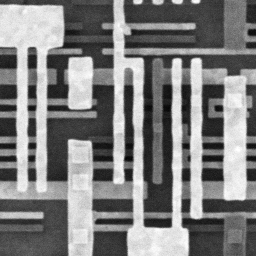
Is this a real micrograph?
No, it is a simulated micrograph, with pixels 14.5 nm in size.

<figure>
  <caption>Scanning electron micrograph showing wiring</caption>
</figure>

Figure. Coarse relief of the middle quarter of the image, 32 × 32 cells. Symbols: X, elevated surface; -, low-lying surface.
-XXXXXX------XXXXXXX--XXX--XX---
-XXXXXX------XX--XXX--XXX--XX---
-XXXXXX------XX---XX--XXX--XX---
-XXXXXX------XX---XX--XXX--XX---
-XXXXXX------XX---XX--XXX--XX---
-XXXXXX------XX---XX--XXX--XX---
-XXXXXX------XX---XX--XXX--XX---
-XXXXXX------XX---XX--XXX--XX---
-XXXXXX------XX---XX--XX---XX---
-XXXXXX------XX---XX---XX--XX---
-XXXXXX------XX---XX--XXX--XX---
-------------XX---XX--XXX--XX---
-------------XX--XXX--XXX--XX---
-------------XX--XXX--XX---XX---
-------------XX--XXX--XXX--XX---
-------------XX---XX--XXX--XX---
-------------XX---XX--XXX--XX---
-------------XX---XX---XX--XX---
-------------XX---XX---XX--XX---
-XXXXXX------XX---XX--XX---XX---
-XXXXXX------XX---XX--XX---XX---
-XXXXXX------XX---XX--XXX--XX---
-XXXXXX------XX---XX--XXX--XX---
-XXXXXX------XX---XX--XXX--XX---
-XXXXXX------XX---XX---XX--XX---
-XXXXXX------XX---XX---XX--XX---
-XXXXXX------XX---XX---XX--XX---
-XXXXXX------XX---XX--XX---XX---
-XXXXXX------XX---XX--XX---XX---
-XXXXXX------XX---XX--XX---XX---
-XXXXXX-----------XX-------XX---
-XXXXXX-----------XX-------XX---